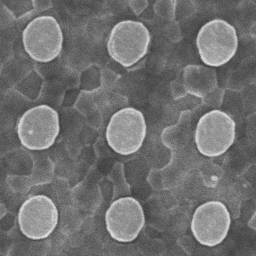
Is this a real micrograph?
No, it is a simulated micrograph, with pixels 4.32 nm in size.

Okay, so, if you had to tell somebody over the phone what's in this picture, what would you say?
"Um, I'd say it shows a regular array of raised bodies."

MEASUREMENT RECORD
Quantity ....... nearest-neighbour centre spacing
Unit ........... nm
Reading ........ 376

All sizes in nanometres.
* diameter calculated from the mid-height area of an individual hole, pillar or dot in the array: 180